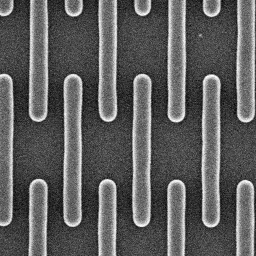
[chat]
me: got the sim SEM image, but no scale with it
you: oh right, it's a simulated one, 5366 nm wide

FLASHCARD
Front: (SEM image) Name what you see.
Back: groups of lines, slits or small figures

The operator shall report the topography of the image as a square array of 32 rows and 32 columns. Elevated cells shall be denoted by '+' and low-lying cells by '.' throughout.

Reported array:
++..++..++..+++..++..++..++...++
+...++..++..+++..++..++...+...++
....++......+++......++.......++
....++......+++......++.......++
....++.......++......++.......++
....++.......++......++.......++
....++......+++......++.......++
....++......++.......++.......++
....++......++.......++.......++
+...++...+...+...+...++...+...++
+...++..++..++...++..++..++...++
++..++..++..++...++..++..++...++
++..++..++..+++..++..++..++...++
++..++..++..+++..++..++..++...++
++..++..++...+...++..++..++...++
++......++.......++......++.....
++......++.......++......++.....
++......++.......++......++.....
+.......++.......++......++.....
+.......++.......++......++.....
+.......++.......++......++.....
+.......++.......++......++.....
+...+...++...+...++......++.....
+...++..++..++...++..++..++...++
+...++..++..++...++..++..++...++
+...++..++..++...++..++..++...++
+...++..++..++...++..++..++...++
+...++..++..++...++..++..++...++
....++......++.......++.......++
....++......++.......++.......++
....++......++.......++.......++
....++......++.......++.......++